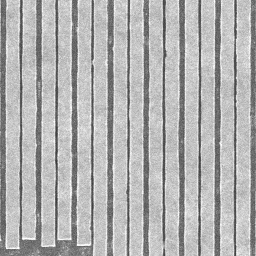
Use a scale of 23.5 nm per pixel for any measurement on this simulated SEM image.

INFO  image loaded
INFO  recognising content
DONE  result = parallel lines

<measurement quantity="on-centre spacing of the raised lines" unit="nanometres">417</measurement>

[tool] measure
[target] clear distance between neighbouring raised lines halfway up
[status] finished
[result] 132 nm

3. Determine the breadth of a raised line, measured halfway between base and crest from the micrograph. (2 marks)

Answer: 311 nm